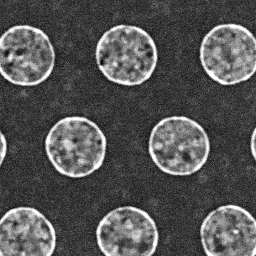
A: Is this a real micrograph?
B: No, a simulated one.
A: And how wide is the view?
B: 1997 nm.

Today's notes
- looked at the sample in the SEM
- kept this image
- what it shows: raised bodies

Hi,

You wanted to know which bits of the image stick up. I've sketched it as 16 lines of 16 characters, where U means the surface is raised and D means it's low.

DDDDDDDDDDDDDDDD
DDDDDDDDDDDDDDDD
UUUDDDUUUDDDDUUU
UUUDDDUUUUDDDUUU
UUUDDDDUUDDDDUUU
DDDDDDDDDDDDDDDD
DDDDDDDDDDDDDDDD
DDDDUDDDDDUUDDDD
DDDUUUDDDUUUUDDD
DDDUUUUDDUUUUDDD
DDDDUUDDDDUUDDDD
DDDDDDDDDDDDDDDD
DDDDDDDDDDDDDDDD
UUUDDDDUUDDDDUUU
UUUDDDUUUUDDDUUU
UUUDDDUUUUDDDUUU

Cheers